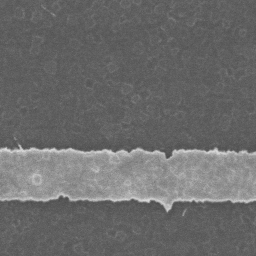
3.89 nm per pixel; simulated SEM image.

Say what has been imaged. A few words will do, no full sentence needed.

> one or a few lines or trenches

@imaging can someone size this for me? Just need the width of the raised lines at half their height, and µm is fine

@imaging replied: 0.192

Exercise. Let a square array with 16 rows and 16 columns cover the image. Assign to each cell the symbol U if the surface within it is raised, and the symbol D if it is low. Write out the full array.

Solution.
DDDDDDDDDDDDDDDD
DDDDDDDDDDDDDDDD
DDDDDDDDDDDDDDDD
DDDDDDDDDDDDDDDD
DDDDDDDDDDDDDDDD
DDDDDDDDDDDDDDDD
DDDDDDDDDDDDDDDD
DDDDDDDDDDDDDDDD
DDDDDDDDDDDDDDDD
UUUUUUUDUUDUUUUD
UUUUUUUUUUUUUUUU
UUUUUUUUUUUUUUUU
DDUDDDDDDUUUUUUU
DDDDDDDDDDDDDDDD
DDDDDDDDDDDDDDDD
DDDDDDDDDDDDDDDD